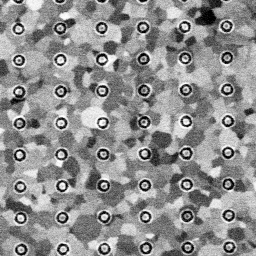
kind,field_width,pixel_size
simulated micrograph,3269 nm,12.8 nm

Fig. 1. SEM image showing a regular array of ring-shaped grooves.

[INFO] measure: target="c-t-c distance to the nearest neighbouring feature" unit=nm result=401